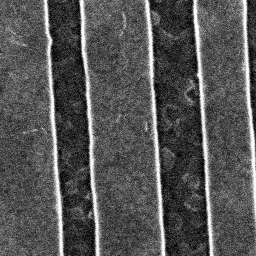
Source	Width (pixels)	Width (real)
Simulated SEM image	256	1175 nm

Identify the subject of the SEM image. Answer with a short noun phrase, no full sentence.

one or a few lines or trenches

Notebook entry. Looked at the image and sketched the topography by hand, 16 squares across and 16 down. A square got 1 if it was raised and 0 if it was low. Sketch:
1110011110001110
1110011110001110
1110011110001110
1110011110001110
1110011110001110
1110011111000111
1110001111000111
1110001111000111
1110001111000111
1110001111000111
1111001111000111
1111001111000111
1111001111000111
1111001111000111
1111001111000111
1111001111000111